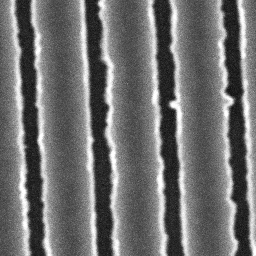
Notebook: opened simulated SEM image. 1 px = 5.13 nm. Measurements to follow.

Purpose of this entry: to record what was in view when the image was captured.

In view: one or a few lines or trenches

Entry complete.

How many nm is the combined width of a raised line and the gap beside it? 354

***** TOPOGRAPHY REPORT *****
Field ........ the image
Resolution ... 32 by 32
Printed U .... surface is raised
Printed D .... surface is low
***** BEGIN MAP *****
UUDDUUUUUUDDUUUUUUUDDUUUUUUUDDUU
UUDDUUUUUUDDDUUUUUUDDDUUUUUUDDUU
UUDDUUUUUUDDDUUUUUUDDDUUUUUUDDUU
UUDDUUUUUUUDDUUUUUUDDDUUUUUUDDUU
UUDDDUUUUUUDDUUUUUUDDDUUUUUUDDUU
UUDDUUUUUUUDDUUUUUUDDDUUUUUUDDUU
UUDDDUUUUUUDDUUUUUUDDDUUUUUUDDUU
UUDDDUUUUUUDDUUUUUUDDDUUUUUUDDUU
UUDDDUUUUUUDDDUUUUUDDDUUUUUUDDUU
UUDDDUUUUUUDDDUUUUUDDDUUUUUUDDUU
UUUDDUUUUUUDDDUUUUUUDDUUUUUUDDUU
UUDDDUUUUUUDDUUUUUUUDDUUUUUUDDDU
UUUDDUUUUUUDDUUUUUUUDDUUUUUUUDDU
UUUDDUUUUUUDDDUUUUUUDDUUUUUUUDDU
UUUDDUUUUUUDDDUUUUUUDDUUUUUUUDDU
UUUDDUUUUUUDDDUUUUUUDDUUUUUUDDDU
UUUDDUUUUUUDDUUUUUUUDDUUUUUUDDDU
UUUDDUUUUUUDDDUUUUUUDDUUUUUUDDDU
UUUDDUUUUUUDDDUUUUUUDDUUUUUUUDDU
UUUDDUUUUUUDDDUUUUUUDDUUUUUUUDDU
UUUDDUUUUUUDDDUUUUUUDDDUUUUUUDDU
UUUDDUUUUUUDDDUUUUUUDDDUUUUUUDDU
UUUDDDUUUUUUDDUUUUUUDDDUUUUUUDDU
UUUDDDUUUUUUDDUUUUUUDDDUUUUUUDDU
UUUDDUUUUUUUDDUUUUUUDDDUUUUUUDDU
UUUDDDUUUUUUDDUUUUUUDDDUUUUUUDDU
UUUDDUUUUUUUDDUUUUUUDDDUUUUUUDDU
UUUDDDUUUUUUDDUUUUUUDDDUUUUUUDDU
UUUDDDUUUUUUDDUUUUUUDDDUUUUUUDDU
UUUDDDUUUUUUDDUUUUUUUDDUUUUUUDDU
UUUDDDUUUUUUDDUUUUUUUDDUUUUUUUDU
UUUDDDUUUUUUDDUUUUUUUDDUUUUUUDDD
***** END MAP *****